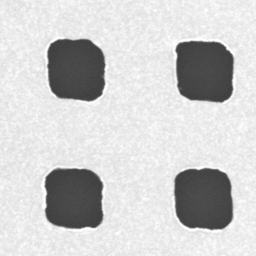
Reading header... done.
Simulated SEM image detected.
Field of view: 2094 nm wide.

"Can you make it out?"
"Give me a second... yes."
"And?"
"holes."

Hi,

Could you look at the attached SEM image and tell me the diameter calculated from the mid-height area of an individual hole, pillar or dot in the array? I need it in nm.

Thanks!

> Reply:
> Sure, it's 519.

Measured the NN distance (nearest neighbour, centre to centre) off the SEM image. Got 1050 nm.